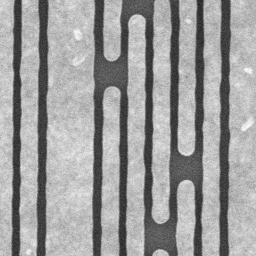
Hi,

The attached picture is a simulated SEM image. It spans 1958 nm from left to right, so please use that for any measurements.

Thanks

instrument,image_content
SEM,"groups of lines, slits or small figures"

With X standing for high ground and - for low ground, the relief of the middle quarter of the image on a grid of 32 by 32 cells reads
XXXXXXX---------XXXX--XXXX---XXX
XXXXXXX---------XXXX--XXXX---XXX
XXXXXXX---------XXXX--XXXX---XXX
XXXXXXX---------XXXX---XXX---XXX
XXXXXXX---------XXXX--XXXX---XXX
XXXXXXX---------XXXX--XXXX---XXX
XXXXXXX----XXX--XXXX--XXXX---XXX
XXXXXXX---XXXX--XXXX--XXXX---XXX
XXXXXXX---XXXX--XXXX--XXXX---XXX
XXXXXXX---XXXX--XXXX--XXXX---XXX
XXXXXXX---XXXX--XXXX--XXXX---XXX
XXXXXXX---XXXX--XXXX--XXXX---XXX
XXXXXXX---XXXX--XXXX--XXXX---XXX
XXXXXXX---XXXX--XXXX--XXXX---XXX
XXXXXXX---XXXX--XXXX--XXXX---XXX
XXXXXXX---XXXX--XXXX--XXXX---XXX
XXXXXXX---XXXX--XXXX--XXXX---XXX
XXXXXXX---XXXX--XXXX--XXXX---XXX
XXXXXXX---XXXX--XXXX--XXXX---XXX
XXXXXXX---XXXX--XXXX--XXXX---XXX
XXXXXXX---XXXX--XXXX--XXXX---XXX
XXXXXXX---XXX---XXXX--XXXX---XXX
XXXXXXX---XXXX--XXXX--XXXX----XX
XXXXXXX---XXXX--XXXX--XXXX------
XXXXXXX---XXXX--XXXX--XXXX------
XXXXXXX---XXXX--XXXX--XXXX------
XXXXXXX---XXXX--XXXX--XXXX------
XXXXXXX---XXXX--XXXX--XXXX------
XXXXXXX---XXXX--XXXX--XXXX------
XXXXXXX---XXXX--XXXX--XXXX----XX
XXXXXXX---XXX---XXXX--XXXX---XXX
XXXXXXX---XXX---XXXX--XXXX--XXXX